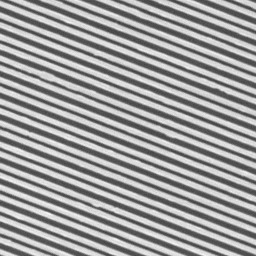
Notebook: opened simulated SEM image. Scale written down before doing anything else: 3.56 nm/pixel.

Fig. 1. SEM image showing parallel lines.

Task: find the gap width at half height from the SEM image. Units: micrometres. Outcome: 0.0162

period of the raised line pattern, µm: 0.0357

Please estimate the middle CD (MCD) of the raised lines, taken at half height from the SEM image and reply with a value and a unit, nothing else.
19.1 nanometers